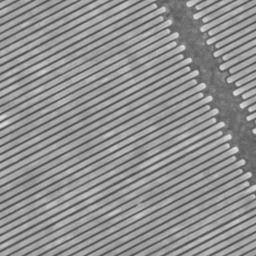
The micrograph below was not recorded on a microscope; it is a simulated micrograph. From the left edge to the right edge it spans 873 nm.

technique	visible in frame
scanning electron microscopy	parallel lines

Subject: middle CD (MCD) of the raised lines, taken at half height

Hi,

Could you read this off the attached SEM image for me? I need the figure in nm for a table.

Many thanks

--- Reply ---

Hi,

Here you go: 18.2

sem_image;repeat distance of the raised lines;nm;24.4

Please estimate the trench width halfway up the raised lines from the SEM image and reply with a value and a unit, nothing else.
6 nm